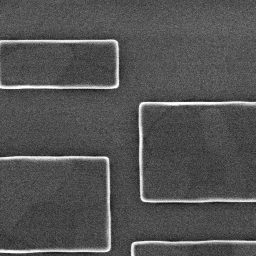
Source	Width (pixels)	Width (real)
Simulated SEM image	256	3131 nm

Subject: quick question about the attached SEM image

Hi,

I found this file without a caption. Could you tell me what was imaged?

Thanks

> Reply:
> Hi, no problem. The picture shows wiring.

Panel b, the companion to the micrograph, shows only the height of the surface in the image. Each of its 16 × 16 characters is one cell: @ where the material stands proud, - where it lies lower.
----------------
----------------
------@---------
@@@@@@@---------
@@@@@@@---------
@@-@@@@---------
---------@@@@@@@
---------@@@@@@@
---------@@@@@@@
---------@@@@@@@
@@@@@@@--@@@@@@@
@@@@@@@--@@@@@@@
@@@@@@@--@@@@@@@
@@@@@@@---------
@@@@@@@---------
@@@@@@@-@@@@@@@@